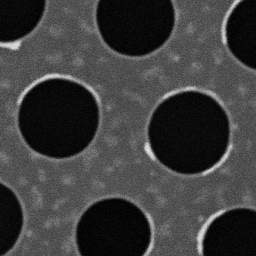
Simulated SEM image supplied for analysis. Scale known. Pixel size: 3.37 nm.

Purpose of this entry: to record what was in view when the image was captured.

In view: holes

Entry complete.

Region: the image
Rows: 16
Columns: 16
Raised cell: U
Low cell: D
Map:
DDDUUUDDDDDUUUUD
DDUUUUDDDDDUUUDD
DUUUUUDDDDUUUUDD
UUUUUUUUDUUUUUUD
UUUUUUUUUUUUUUUU
UUDDDUUUUUUUUUUU
UDDDDDUUUUDDDDUU
UDDDDDUUUDDDDDUU
UDDDDDUUUDDDDDUU
UUDDDUUUUUDDDDUU
UUUUUUUUUUDDDUUU
UUUUUUUUUUUUUUUU
DUUUUUDDUUUUUUUU
DUUUUDDDDUUUUUDD
DUUUUDDDDUUUUDDD
DUUUUDDDDUUUUDDD